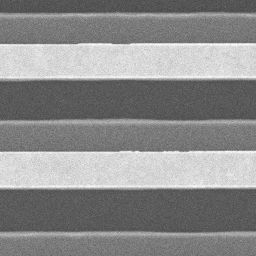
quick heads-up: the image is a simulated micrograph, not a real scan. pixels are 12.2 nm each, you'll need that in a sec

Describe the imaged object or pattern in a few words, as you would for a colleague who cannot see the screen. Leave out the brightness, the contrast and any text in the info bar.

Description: lines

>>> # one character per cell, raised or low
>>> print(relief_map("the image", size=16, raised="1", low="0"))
0000000000000000
1111111111111111
1111111111111111
1111111111111111
1111111111111111
0000000000000000
0000000000000000
0000000000000000
1111111111111111
1111111111111111
1111111111111111
1111111111111111
0000000000000000
0000000000000000
0000000000000000
1111111111111111